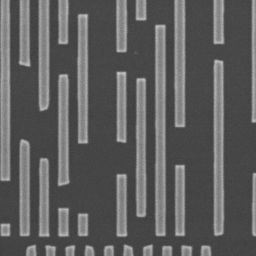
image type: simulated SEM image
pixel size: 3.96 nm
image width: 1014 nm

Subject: wiring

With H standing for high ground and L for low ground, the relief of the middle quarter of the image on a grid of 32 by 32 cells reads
LLLLHHLLLLLLLLLLLLLLLLLHHLLLHHLL
LLLLHHLLLLLLLLLLLLLLLLLHHLLLHHLL
LLLLHHLLLLLLLHHLLLLLLLLHHLLLHHLL
HLLLHHLLLLLLLHHLLLLLLLLHHLLLHHLL
HLLLHHLLLLLLLHHLLLHHLLLHHLLLHHLL
HLLLHHLLLLLLLHHLLLHHLLLHHLLLHHLL
HLLLHHLLLLLLLHHLLLHHLLLHHLLLHHLL
HLLLHHLLLLLLLHHLLLHHLLLHHLLLHHLL
HLLLHHLLLLLLLHHLLLHHLLLHHLLLHHLL
HLLLHHLLLLLLLHHLLLHHLLLHHLLLHHLL
HLLLHHLLLLLLLHHLLLHHLLLHHLLLHHLL
HLLLHHLLLLLLLHHLLLHHLLLHHLLLHHLL
HLLLHHLLLLLLLHHLLLHHLLLHHLLLHHLL
HLLLHHLLLLLLLHHLLLHHLLLHHLLLHHLL
HLLLHHLLLLLLLHHLLLHHLLLHHLLLHHLL
HLLLHHLLLLLLLHHLLLHHLLLHHLLLHHLL
HLLLHHLLLLLLLHHLLLHHLLLHHLLLLLLL
HLLLHHLLLLLLLHHLLLHHLLLHHLLLLLLL
HLLLHHLLLLLLLHHLLLHHLLLHHLLLLLLL
HLLLHHLLLLLLLLLLLLHHLLLHHLLLLLLL
HLLLLLLLLLLLLLLLLLHHLLLHHLLLLLLL
HLLLLLLLLLLLLLLLLLHHLLLHHLLLLLLL
HLLLLLLLLLLLLLLLLLHHLLLHHLLLLLLL
HLLLLLLLLLLLLLLLLLHHLLLHHLLLLLLL
HLLLLLLLLLLLLLLLLLHHLLLHHLLLLLLL
HLLLLLLLLLLLLLLLLLHHLLLHHLLLHHLL
HLLLLLLLLLLLLLLLLLHHLLLHHLLLHHLL
HLLLLLLLLLLLLLLLLLHHLLLHHLLLHHLL
HLLLLLLLLLLLLHHLLLHHLLLHHLLLHHLL
HLLLLLLLLLLLLHHLLLHHLLLHHLLLHHLL
LLLLLLLLLLLLLHHLLLHHLLLHHLLLHHLL
LLLLLLLLLLLLLHHLLLHHLLLHHLLLHHLL